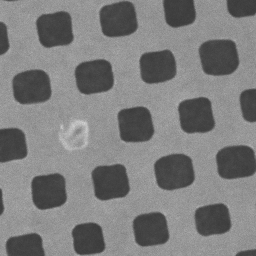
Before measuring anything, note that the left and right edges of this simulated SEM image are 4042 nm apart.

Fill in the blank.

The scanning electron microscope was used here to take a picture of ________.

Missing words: a regular array of holes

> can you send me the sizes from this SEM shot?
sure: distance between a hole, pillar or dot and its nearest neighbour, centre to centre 61.5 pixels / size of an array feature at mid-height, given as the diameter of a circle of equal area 594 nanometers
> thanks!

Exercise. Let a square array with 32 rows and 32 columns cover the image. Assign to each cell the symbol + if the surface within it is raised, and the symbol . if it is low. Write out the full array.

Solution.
++++++++++++++...+++....++++....
+++++++.++++.....++++...+++++...
+++++....++++....++++...++++++++
.++++....++++....+++++++++++++++
.++++....++++..+++++++++++++++++
.++++....++++++++++++++++....+++
.++++++++++++++++++..++++.....++
++++++++++++.++++.....+++.....++
++++++++++....+++.....+++.....++
++....+++.....++++....++++++++++
++....++++....++++++++++++++++++
++....++++...+++++++++++++++++..
++....+++++++++++++++++...++++..
++++++++++++++++..++++....++++..
+++++++++++++++....+++.....+++..
+++++++++++++++....++++....+++++
...++++++++++++....++++...++++++
...++++++++++++....+++++++++++++
...+++++++++++++++++++++++++...+
...++++++++++++++++++..++++.....
+++++++++++++++++++.....+++.....
++++++++++++....+++.....+++.....
++++....++++....++++....++++++++
++++....++++....++++...+++++++++
++++....++++....++++++++++++++++
++++....+++++++++++++++++++.++++
++++++++++++++++++++++++.....+++
+++++++++++++++++....+++.....+++
+++++++++....++++....++++....+++
++...++++....++++....+++++++++++
+....++++....++++...++++++++++++
+.....++++...+++++++++++++++++..